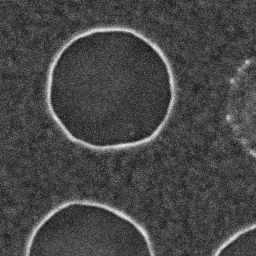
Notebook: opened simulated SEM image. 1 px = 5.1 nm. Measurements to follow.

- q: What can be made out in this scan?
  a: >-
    holes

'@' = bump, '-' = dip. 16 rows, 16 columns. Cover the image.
@@@@@@@@@@@@@@@@
@@@@@@@@@@@@@@@@
@@@@@----@@@@@@@
@@@@------@@@@@@
@@@--------@@@@@
@@@--------@@@@@
@@@--------@@@@@
@@@@------@@@@@@
@@@@@----@@@@@@@
@@@@@@@@@@@@@@@@
@@@@@@@@@@@@@@@@
@@@@@@@@@@@@@@@@
@@@@@@@@@@@@@@@@
@@@-----@@@@@@@@
@@-------@@@@@@-
@@-------@@@@@--